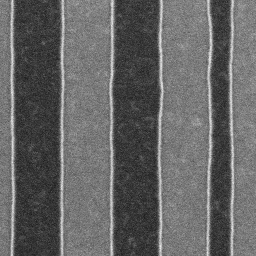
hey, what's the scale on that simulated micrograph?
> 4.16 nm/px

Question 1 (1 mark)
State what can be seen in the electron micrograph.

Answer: one or a few lines or trenches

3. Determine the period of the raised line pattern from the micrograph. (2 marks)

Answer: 381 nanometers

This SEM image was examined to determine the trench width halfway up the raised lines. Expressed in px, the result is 48.8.